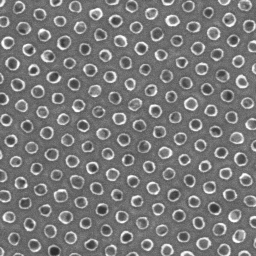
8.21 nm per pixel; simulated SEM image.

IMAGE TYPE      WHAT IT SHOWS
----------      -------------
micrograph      a regular array of raised bodies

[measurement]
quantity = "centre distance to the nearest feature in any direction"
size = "170 nm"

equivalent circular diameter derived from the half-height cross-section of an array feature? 0.0958 microns